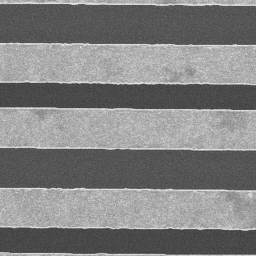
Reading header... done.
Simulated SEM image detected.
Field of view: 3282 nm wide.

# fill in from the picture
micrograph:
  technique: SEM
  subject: lines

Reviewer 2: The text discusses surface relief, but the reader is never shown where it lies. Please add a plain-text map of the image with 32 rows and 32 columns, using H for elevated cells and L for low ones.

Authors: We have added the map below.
LLLLLLLLHHHHHHHHHHHHHHHHHHHHHHHH
LLLLLLLLLLLLLLLLLLLLLLLLLLLLLLLL
LLLLLLLLLLLLLLLLLLLLLLLLLLLLLLLL
LLLLLLLLLLLLLLLLLLLLLLLLLLLLLLLL
LLLLLLLLLLLLLLLLLLLLLLLLLLLLLLLL
HHHHHHHHHHHHLLLLLLLLLLLLLLLLLLLL
HHHHHHHHHHHHHHHHHHHHHHHHHHHHHHHH
HHHHHHHHHHHHHHHHHHHHHHHHHHHHHHHH
HHHHHHHHHHHHHHHHHHHHHHHHHHHHHHHH
HHHHHHHHHHHHHHHHHHHHHHHHHHHHHHHH
LLLLLLLLLLLLLLLLLLLLLLLLLLLLLLHH
LLLLLLLLLLLLLLLLLLLLLLLLLLLLLLLL
LLLLLLLLLLLLLLLLLLLLLLLLLLLLLLLL
LLLLLLLLLLLLLLLLLLLLLLLLLLLLLLLL
HHHHHHHHHHHHHHHHHHHHHHHHHHHHHHHH
HHHHHHHHHHHHHHHHHHHHHHHHHHHHHHHH
HHHHHHHHHHHHHHHHHHHHHHHHHHHHHHHH
HHHHHHHHHHHHHHHHHHHHHHHHHHHHHHHH
LLLLHHHHHHHHHHHHHHHHHHHHHHHHHHHH
LLLLLLLLLLLLLLLLLLLLLLLLLLLLLLLL
LLLLLLLLLLLLLLLLLLLLLLLLLLLLLLLL
LLLLLLLLLLLLLLLLLLLLLLLLLLLLLLLL
LLLLLLLLLLLLLLLLLLLLLLLLLLLLLLLL
LLLLLLLLLLLLLLLLLLLLLLLLLLLLLLLL
HHHHHHHHHHHHHHHHHHHHHHHHHHHHHHHH
HHHHHHHHHHHHHHHHHHHHHHHHHHHHHHHH
HHHHHHHHHHHHHHHHHHHHHHHHHHHHHHHH
HHHHHHHHHHHHHHHHHHHHHHHHHHHHHHHH
LLLLLLLLLLHLLLHLHHHHHHHHHHHHHHHH
LLLLLLLLLLLLLLLLLLLLLLLLLLLLLLLL
LLLLLLLLLLLLLLLLLLLLLLLLLLLLLLLL
LLLLLLLLLLLLLLLLLLLLLLLLLLLLLLLL